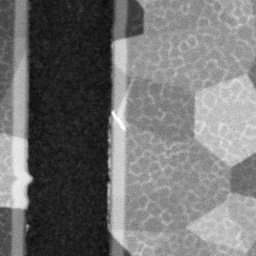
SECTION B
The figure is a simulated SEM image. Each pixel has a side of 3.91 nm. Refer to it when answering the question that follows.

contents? one or a few lines or trenches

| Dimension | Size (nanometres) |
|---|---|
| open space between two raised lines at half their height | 396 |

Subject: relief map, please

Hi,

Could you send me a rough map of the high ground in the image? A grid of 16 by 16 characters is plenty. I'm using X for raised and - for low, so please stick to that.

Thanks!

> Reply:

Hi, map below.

X-------XXXXXXXX
X-------XXXXXXXX
X------XXXXXXXXX
X-------XXXXXXXX
X-------XXXXXXXX
X-------XXXXXXXX
X-------XXXXXXXX
X------XXXXXXXXX
X------XXXXXXXXX
X------XXXXXXXXX
X------XXXXXXXXX
X------XXXXXXXXX
X------XXXXXXXXX
X------XXXXXXXXX
X------XXXXXXXXX
X------XXXXXXXXX